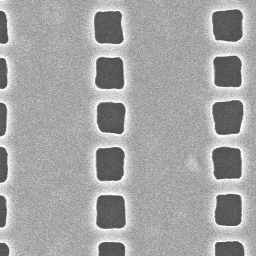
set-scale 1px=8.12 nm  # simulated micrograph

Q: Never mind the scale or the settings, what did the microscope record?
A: a regular array of holes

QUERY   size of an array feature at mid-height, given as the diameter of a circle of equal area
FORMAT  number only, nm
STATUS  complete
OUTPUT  274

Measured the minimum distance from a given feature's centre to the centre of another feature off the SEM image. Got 371 nanometers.